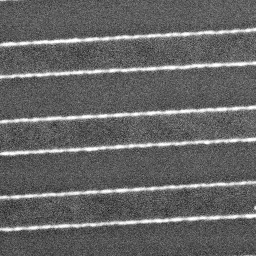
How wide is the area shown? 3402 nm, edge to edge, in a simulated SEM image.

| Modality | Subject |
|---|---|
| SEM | lines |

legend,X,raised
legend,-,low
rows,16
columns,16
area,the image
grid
----------------
----------------
-----XXXXXXXXXXX
XXXXXXXXXXXXXXXX
XXXXXX----------
----------------
----------------
--XXXXXXXXXXXXXX
XXXXXXXXXXXXXXXX
XX--------------
----------------
--------------XX
XXXXXXXXXXXXXXXX
XXXXXXXXXXXXXXXX
----------------
----------------